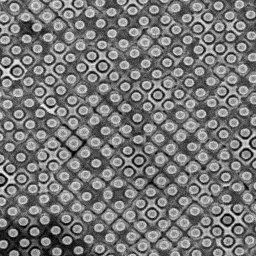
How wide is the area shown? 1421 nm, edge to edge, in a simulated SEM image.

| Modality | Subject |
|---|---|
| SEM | a regular array of raised bodies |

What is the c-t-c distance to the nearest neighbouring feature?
81.7 nanometres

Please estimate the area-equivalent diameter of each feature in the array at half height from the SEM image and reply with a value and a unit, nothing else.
48.5 nm